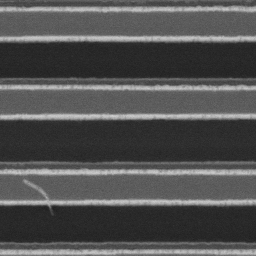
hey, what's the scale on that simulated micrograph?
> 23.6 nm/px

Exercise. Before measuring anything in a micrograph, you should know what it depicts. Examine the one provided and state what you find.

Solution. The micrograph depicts lines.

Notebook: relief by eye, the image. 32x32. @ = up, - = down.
@@@@@@@@@@@@@@@@@@@@@@@@@@@@@@@@
@@@@@@@@@@@@@@@@@@@@@@@@@@@@@@@@
@@@@@@@@@@@@@@@@@@@@@@@@@@@@@@@@
@@@@@@@@@@@@@@@@@@@@@@@@@@@@@@@@
@@@@@@@@@@@@@@@@@@@@@@@@@@@@@@@@
--------------------------------
--------------------------------
--------------------------------
--------------------------------
--------------------------------
@@@@@@@@@@@@@@@@@@@@@@@@@@@@@@@@
@@@@@@@@@@@@@@@@@@@@@@@@@@@@@@@@
@@@@@@@@@@@@@@@@@@@@@@@@@@@@@@@@
@@@@@@@@@@@@@@@@@@@@@@@@@@@@@@@@
@@@@@@@@@@@@@@@@@@@@@@@@@@@@@@@@
--------------------------------
--------------------------------
--------------------------------
--------------------------------
--------------------------------
@@@@@@@@@@@@@@@@@@@@@@@@@@@@@@@@
@@@@@@@@@@@@@@@@@@@@@@@@@@@@@@@@
@@@@@@@@@@@@@@@@@@@@@@@@@@@@@@@@
@@@@@@@@@@@@@@@@@@@@@@@@@@@@@@@@
@@@@@@@@@@@@@@@@@@@@@@@@@@@@@@@@
@@@@@@@@@@@@@@@@@@@@@@@@@@@@@@@@
--------------------------------
--------------------------------
--------------------------------
--------------------------------
@@@-@-@@@@@@-@@@@@@@@@@@@@@@@@@-
@@@@@@@@@@@@@@@@@@@@@@@@@@@@@@@@